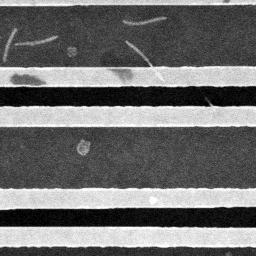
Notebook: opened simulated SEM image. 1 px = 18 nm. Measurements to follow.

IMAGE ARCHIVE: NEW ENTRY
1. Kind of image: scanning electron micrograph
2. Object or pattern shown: lines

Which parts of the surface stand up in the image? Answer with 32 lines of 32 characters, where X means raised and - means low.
XXXXXXXXXXXXXXXXXXXXXXXXXXXXXXXX
--------------------------------
--------------------------------
--------------------------------
--------------------------------
--------------------------------
--------------------------------
--------------------------------
------------------XXX-XX-XXXXXXX
XXXXXXXXXXXXXXXXXXXXXXXXXXXXXXXX
XXXXXXXXXXXXXXXXXXXXXXXXXXXXXXXX
--------------------------------
--------------------------------
XXXXXXXXXXXXXXXXXXXXXXXXXXXXXXXX
XXXXXXXXXXXXXXXXXXXXXXXXXXXXXXXX
XXXXXXXXXXXXXXXXXXXXXXXXXXXXXXXX
--------------------------------
--------------------------------
--------------------------------
--------------------------------
--------------------------------
--------------------------------
--------------------------------
--------------------------------
XXXXXXXXXXXXXXXXXXXXXXXXXXXXXXXX
XXXXXXXXXXXXXXXXXXXXXXXXXXXXXXXX
--------------------------------
--------------------------------
XXXXXXXXXXXXXXXXXXXXXXXXXX--X---
XXXXXXXXXXXXXXXXXXXXXXXXXXXXXXXX
XXXXXXXXXXXXXXXXXXXXXXXXXXXXXXXX
--------------------------------